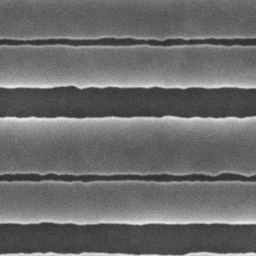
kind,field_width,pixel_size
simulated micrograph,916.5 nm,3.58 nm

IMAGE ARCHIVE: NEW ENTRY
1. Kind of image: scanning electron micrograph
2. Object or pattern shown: lines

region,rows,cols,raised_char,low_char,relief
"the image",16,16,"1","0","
1111111111111111
1111111111111111
1111111111111111
1111111111111111
1111111111111111
0000000000000000
0000000000000000
1111111111111111
1111111111111111
1111111111111111
1111111111111111
1111111111111111
1111111111111111
1111111111111111
0000000000000000
0000000000000000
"